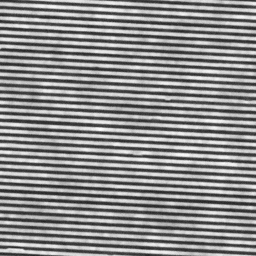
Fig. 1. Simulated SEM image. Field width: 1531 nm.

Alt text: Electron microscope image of parallel lines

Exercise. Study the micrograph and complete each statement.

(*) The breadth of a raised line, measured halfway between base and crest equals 17.2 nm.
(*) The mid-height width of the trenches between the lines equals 23.1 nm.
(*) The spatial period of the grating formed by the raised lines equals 42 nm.